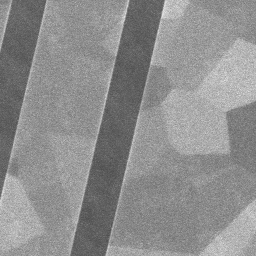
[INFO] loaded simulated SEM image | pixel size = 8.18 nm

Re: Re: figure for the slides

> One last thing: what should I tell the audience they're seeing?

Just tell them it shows one or a few lines or trenches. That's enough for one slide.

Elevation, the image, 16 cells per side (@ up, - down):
@--@@@@@--@@@@@@
---@@@@@--@@@@@@
--@@@@@---@@@@@@
--@@@@@---@@@@@@
--@@@@@--@@@@@@@
--@@@@@--@@@@@@@
-@@@@@@--@@@@@@@
-@@@@@---@@@@@@@
-@@@@@--@@@@@@@@
-@@@@@--@@@@@@@@
-@@@@@--@@@@@@@@
@@@@@---@@@-@@@@
@@@@@--@@@@@@@@@
@@@@@--@@@@@@@@@
@@@@@--@@@@@@@@@
@@@@---@@@@@@@@@